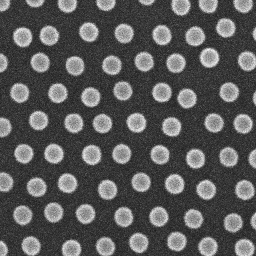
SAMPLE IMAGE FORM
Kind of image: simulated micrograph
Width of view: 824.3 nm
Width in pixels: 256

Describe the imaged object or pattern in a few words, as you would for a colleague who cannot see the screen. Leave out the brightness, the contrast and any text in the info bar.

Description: a regular array of raised bodies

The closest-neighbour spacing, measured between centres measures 98.6 nanometres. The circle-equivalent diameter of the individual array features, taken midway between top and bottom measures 0.0565 microns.